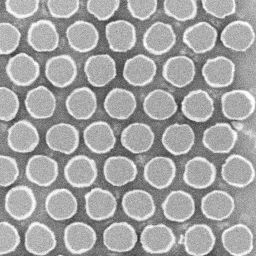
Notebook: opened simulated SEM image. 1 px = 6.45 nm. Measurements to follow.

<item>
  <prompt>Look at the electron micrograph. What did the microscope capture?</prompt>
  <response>a regular array of raised bodies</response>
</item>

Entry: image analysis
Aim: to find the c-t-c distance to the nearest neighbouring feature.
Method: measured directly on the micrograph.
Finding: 243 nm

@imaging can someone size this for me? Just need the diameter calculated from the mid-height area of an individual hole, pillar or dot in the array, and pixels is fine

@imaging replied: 30.6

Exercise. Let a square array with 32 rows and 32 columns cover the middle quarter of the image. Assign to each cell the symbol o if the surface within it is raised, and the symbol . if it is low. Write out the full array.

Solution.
ooo..oooooooo..oooooooo..ooooooo
ooo..oooooooo..oooooooo..ooooooo
ooo...ooooooo..oooooooo..ooooooo
oo....oooooo...ooooooo...ooooooo
oo....ooooo.....ooooo.....oooooo
........oo..................oo..
....ooo.....ooo........o........
..ooooo....oooooo.....oooo......
.ooooooo..oooooooo...oooooo...oo
.ooooooo..oooooooo..oooooooo..oo
.ooooooo..oooooooo..oooooooo..oo
.ooooooo..oooooooo..oooooooo..oo
..ooooo....oooooo....oooooo...oo
...ooo.......ooo......oooo.....o
................................
oo....ooooo.....ooooo......oooo.
ooo...oooooo...oooooo.....oooooo
ooo..ooooooo...ooooooo...ooooooo
oooo.oooooooo.oooooooo...ooooooo
oooo.oooooooo.oooooooo...ooooooo
ooo...oooooo...ooooooo...ooooooo
ooo....oooo.....ooooo.....ooooo.
...........................oo...
...ooo.....ooooo.......oo.......
.oooooo....oooooo....oooooo....o
.oooooo...oooooooo...oooooo....o
oooooooo..oooooooo..oooooooo...o
.ooooooo..oooooooo..oooooooo..oo
.ooooooo...ooooooo...oooooo...oo
.oooooo....ooooo.....oooooo....o
......................oooo......
o......oo.......................